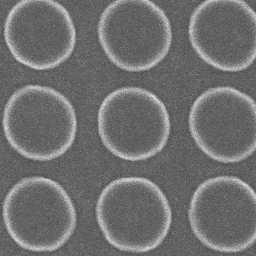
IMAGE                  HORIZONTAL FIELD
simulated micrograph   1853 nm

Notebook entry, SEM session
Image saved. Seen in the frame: raised bodies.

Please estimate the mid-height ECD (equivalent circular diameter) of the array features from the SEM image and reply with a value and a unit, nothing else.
511 nm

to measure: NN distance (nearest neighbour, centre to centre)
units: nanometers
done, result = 661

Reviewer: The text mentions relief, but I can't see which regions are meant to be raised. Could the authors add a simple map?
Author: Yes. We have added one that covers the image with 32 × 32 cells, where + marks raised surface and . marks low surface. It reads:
..+++++.......+++++.......++++..
..++++++.....+++++++....+++++++.
.++++++++....++++++++...++++++++
.++++++++....++++++++...++++++++
.++++++++....++++++++...++++++++
.++++++++....++++++++...++++++++
..+++++++....++++++++....+++++++
..++++++......++++++......+++++.
................++.........+++..
................................
................................
..+++++........+++........++++..
.+++++++.....+++++++.....++++++.
.++++++++....++++++++...++++++++
.++++++++....++++++++...++++++++
.++++++++....++++++++...++++++++
.++++++++....++++++++...++++++++
.++++++++....++++++++....+++++++
..++++++......++++++.....+++++++
....+++........++++.......+++++.
................................
................................
....++.........+++.........+++..
..++++++.....+++++++.....++++++.
.+++++++.....+++++++....++++++++
.++++++++...+++++++++...++++++++
.++++++++...+++++++++...++++++++
.++++++++...+++++++++...++++++++
.++++++++....++++++++...++++++++
..++++++.....+++++++.....+++++++
...+++++......++++++......+++++.
................................